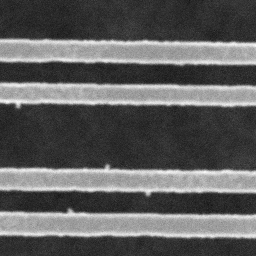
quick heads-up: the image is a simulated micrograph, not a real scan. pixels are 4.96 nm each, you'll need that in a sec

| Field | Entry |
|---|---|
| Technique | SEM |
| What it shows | lines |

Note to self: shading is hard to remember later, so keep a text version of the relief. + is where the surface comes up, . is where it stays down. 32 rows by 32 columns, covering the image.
................................
................................
................................
................................
................................
++++++++++++++++++++++++++++++++
++++++++++++++++++++++++++++++++
++++++++++++++++++++++++++++++++
................................
................................
++++++.+........................
++++++++++++++++++++++++++++++++
++++++++++++++++++++++++++++++++
................................
................................
................................
................................
................................
................................
................................
................................
++++++++++++++++++++++++++++++++
++++++++++++++++++++++++++++++++
++++++++++++++++++++++++++++++++
................................
................................
................................
++++++++++++++++++++++++++++++++
++++++++++++++++++++++++++++++++
..........+.........++++++++++++
................................
................................